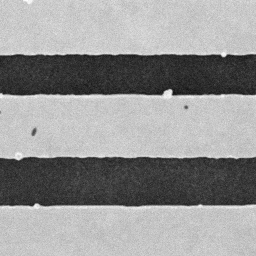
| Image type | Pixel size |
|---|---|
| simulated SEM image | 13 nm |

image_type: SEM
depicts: lines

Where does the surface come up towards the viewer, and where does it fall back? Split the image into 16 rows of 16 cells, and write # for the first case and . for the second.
################
################
################
................
................
................
################
################
################
################
................
................
................
################
################
################